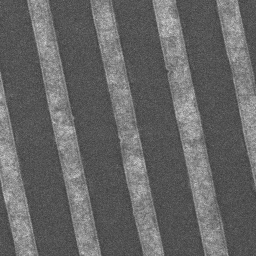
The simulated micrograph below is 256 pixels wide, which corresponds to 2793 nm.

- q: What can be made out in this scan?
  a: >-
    one or a few lines or trenches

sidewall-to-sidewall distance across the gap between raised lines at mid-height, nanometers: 451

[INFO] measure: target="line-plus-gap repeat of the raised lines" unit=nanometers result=675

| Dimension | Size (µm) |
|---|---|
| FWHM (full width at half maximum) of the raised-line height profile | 0.222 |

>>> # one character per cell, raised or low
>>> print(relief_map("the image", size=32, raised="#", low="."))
....##.....###.....###.....###..
....##......##.....###.....###..
....##......##......##.....###..
....###.....###.....###.....##..
....###.....###.....###.....###.
.....##.....###.....###.....###.
.....##......##.....###.....###.
.....##......##......##......##.
.....###.....###.....###.....##.
.....###.....###.....###.....###
......##......##.....###.....###
......##......##.....###.....###
#.....###.....###.....##......##
#.....###.....###.....###.....##
#.....###.....###.....###.....##
#......##......##.....###.....##
#......##......##.....###......#
##.....###.....##......###.....#
##.....###.....###.....###.....#
##.....###.....###.....###.....#
##......##.....###.....###.....#
###.....##......##......##......
###.....###.....###.....###.....
###.....###.....###.....###.....
.##......##.....###.....###.....
.##......##......##.....###.....
.###.....###.....##......##.....
.###.....###.....###.....###....
.###.....###.....###.....###....
..##.....###.....###.....###....
..##......##......##.....###....
..###.....##......##......##....